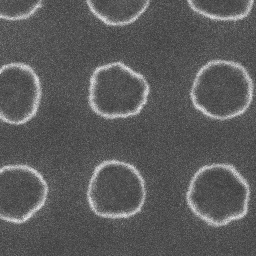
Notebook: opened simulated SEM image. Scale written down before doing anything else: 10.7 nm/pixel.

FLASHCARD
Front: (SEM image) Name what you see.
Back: raised bodies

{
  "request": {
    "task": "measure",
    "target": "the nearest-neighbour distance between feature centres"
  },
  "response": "1070 nanometers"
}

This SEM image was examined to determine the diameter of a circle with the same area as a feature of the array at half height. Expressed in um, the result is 0.607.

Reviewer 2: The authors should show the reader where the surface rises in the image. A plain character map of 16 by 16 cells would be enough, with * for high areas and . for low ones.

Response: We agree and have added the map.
**....***...****
................
................
................
**....**.....**.
**....***...****
**....***...****
**..............
................
................
**....**.....*..
***...***...***.
***...***...***.
**...........**.
................
................